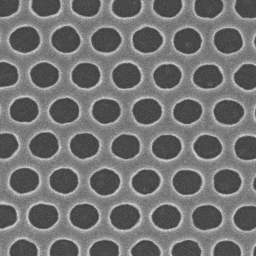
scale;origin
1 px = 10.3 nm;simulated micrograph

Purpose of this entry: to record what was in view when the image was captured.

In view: a regular array of holes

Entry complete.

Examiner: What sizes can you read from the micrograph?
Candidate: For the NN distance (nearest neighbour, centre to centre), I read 0.413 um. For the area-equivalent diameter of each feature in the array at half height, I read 0.284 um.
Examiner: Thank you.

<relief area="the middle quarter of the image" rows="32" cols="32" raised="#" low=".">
###.....#####.....######....####
##.......###.......####......###
##.......###.......###........##
##.......###.......###.......###
##.......###.......####......###
####....#####.....#####.....####
################################
################################
.###################..##########
...#####.....#####.....######...
....###.......###.......####....
....###.......###........##.....
....###.......###........##.....
...####.......####......####....
..#######...######.....######...
################################
################################
###...##########################
##......#####.....#####.....####
##.......###.......###.......###
#........###.......###.......###
##.......###.......###.......###
##......####......####.......###
####..#########..######....#####
################################
################################
..#######..########...#######...
...####......#####......####....
...####.......###.......###.....
....##........###.......###.....
...####.......###.......###.....
...####......#####.....#####....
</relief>